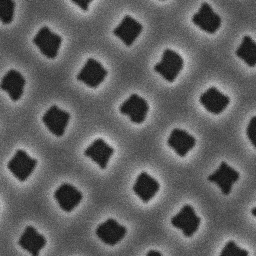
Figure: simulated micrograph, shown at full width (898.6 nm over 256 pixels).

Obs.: a regular array of holes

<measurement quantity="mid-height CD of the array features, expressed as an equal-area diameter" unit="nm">95.2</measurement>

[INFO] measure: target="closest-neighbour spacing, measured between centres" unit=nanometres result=191